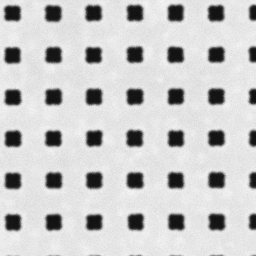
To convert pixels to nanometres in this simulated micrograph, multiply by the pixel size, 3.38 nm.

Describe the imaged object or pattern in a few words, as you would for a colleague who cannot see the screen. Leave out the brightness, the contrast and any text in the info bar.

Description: a regular array of holes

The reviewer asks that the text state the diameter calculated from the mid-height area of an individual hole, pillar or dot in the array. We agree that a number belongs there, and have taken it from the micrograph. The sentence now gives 60.9 nanometres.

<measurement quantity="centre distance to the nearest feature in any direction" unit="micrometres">0.137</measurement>